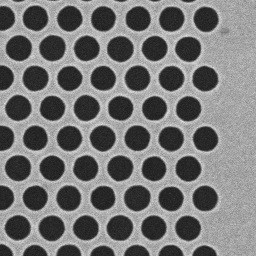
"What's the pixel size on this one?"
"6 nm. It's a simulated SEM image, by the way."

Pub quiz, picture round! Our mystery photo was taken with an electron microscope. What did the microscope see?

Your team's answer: a regular array of holes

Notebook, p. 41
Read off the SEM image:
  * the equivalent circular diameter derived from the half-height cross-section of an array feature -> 151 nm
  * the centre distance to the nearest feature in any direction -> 202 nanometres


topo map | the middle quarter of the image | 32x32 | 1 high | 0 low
10111111111111111101111111001111
00001110000011110000011110000111
00001110000001100000011100000011
00000100000001100000001100000011
00001110000001100000011100000011
00001110000011110000011100000111
00011111100111111000111110001111
11111111111111111111111111111111
11110001111100001111100011111100
11100000011000000111000001111000
11000000011000000110000000110000
11000000011000000110000000110000
11100000111000000111000001110000
11100000111100001111100011111000
11111111111111111111111111111111
10111111100111111001111111111111
00001110000011110000011100000111
00001110000001100000011100000011
00000100000001100000001100000011
00001110000001100000011100000011
00001110000011110000011100000111
00011111000111111001111111001111
11111111111111111111111111111111
11100001111100001111100011111000
11100000111000000111000001110000
11100000111000000111000001110000
11000000011000000110000000110000
11100000111000000111000001110000
11110000111100001111000011111000
11111111111111111111111111111111
00111111111111111101111111111111
00001111000011110000011110000111